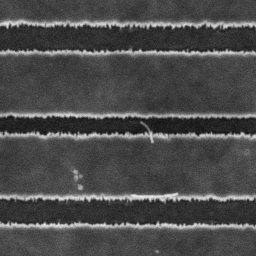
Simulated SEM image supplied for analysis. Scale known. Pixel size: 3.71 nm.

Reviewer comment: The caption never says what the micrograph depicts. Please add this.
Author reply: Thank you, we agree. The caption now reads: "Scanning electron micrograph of lines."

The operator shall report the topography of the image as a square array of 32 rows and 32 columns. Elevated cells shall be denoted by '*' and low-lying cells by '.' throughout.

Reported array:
********************************
********************************
********************************
................................
................................
................................
*************************.***.**
********************************
********************************
********************************
********************************
********************************
********************************
********************************
********************************
................................
................................
********************************
********************************
********************************
********************************
********************************
********************************
********************************
********************************
................................
................................
................................
********************************
********************************
********************************
********************************